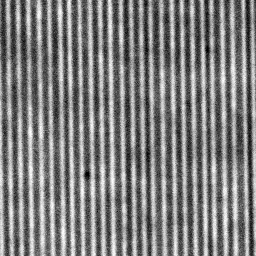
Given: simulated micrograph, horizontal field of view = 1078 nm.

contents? parallel lines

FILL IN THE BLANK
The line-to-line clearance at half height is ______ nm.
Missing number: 26.9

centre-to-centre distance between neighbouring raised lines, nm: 43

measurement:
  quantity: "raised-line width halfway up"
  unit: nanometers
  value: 15.3